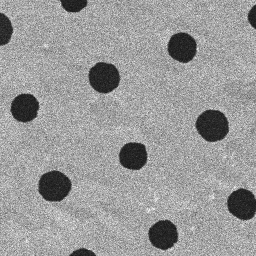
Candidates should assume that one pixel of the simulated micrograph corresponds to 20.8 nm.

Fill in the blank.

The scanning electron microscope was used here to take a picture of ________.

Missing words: holes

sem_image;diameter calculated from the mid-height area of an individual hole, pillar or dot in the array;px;29.9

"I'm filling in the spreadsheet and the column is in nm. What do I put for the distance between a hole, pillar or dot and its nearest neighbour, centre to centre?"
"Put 1750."